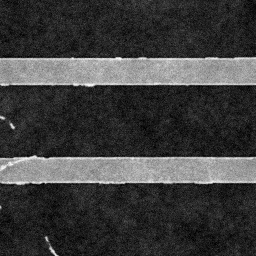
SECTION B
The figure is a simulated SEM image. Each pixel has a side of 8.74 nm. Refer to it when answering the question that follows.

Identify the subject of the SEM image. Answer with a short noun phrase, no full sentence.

lines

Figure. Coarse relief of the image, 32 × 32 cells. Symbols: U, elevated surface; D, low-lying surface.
DDDDDDDDDDDDDDDDDDDDDDDDDDDDDDDD
DDDDDDDDDDDDDDDDDDDDDDDDDDDDDDDD
DDDDDDDDDDDDDDDDDDDDDDDDDDDDDDDD
DDDDDDDDDDDDDDDDDDDDDDDDDDDDDDDD
DDDDDDDDDDDDDDDDDDDDDDDDDDDDDDDD
DDDDDDDDDDDDDDDDDDDDDDDDDDDDDDDD
DDDDDDDDDDDDDDDDDDDDDDDDDDDDDDDD
UUUUUUUUUUUUUUUUUUUUUUUUUUUUUUUU
UUUUUUUUUUUUUUUUUUUUUUUUUUUUUUUU
UUUUUUUUUUUUUUUUUUUUUUUUUUUUUUUU
UUUUUUUUUUUUUUUUUUUUUUUUUUUUUUUU
DDDDDDDDDDDDDDDDDDDDDDDDDDDDDDDD
DDDDDDDDDDDDDDDDDDDDDDDDDDDDDDDD
DDDDDDDDDDDDDDDDDDDDDDDDDDDDDDDD
DDDDDDDDDDDDDDDDDDDDDDDDDDDDDDDD
DDDDDDDDDDDDDDDDDDDDDDDDDDDDDDDD
DDDDDDDDDDDDDDDDDDDDDDDDDDDDDDDD
DDDDDDDDDDDDDDDDDDDDDDDDDDDDDDDD
DDDDDDDDDDDDDDDDDDDDDDDDDDDDDDDD
DDDDDDDDDDDDDDDDDDDDDDDDDDDDDDDD
UUUUUUUUUUUUUUUUUUUUUUUUUUUUUUUU
UUUUUUUUUUUUUUUUUUUUUUUUUUUUUUUU
UUUUUUUUUUUUUUUUUUUUUUUUUUUUUUUU
DDDDDDDDDDDDDDDDDDDDDDDDDDDDDDDD
DDDDDDDDDDDDDDDDDDDDDDDDDDDDDDDD
DDDDDDDDDDDDDDDDDDDDDDDDDDDDDDDD
DDDDDDDDDDDDDDDDDDDDDDDDDDDDDDDD
DDDDDDDDDDDDDDDDDDDDDDDDDDDDDDDD
DDDDDDDDDDDDDDDDDDDDDDDDDDDDDDDD
DDDDDDDDDDDDDDDDDDDDDDDDDDDDDDDD
DDDDDDDDDDDDDDDDDDDDDDDDDDDDDDDD
DDDDDDDDDDDDDDDDDDDDDDDDDDDDDDDD